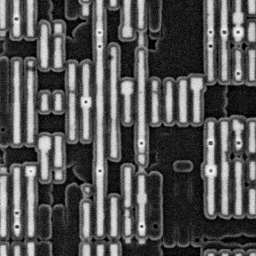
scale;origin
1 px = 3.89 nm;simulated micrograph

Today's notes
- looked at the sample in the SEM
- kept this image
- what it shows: wiring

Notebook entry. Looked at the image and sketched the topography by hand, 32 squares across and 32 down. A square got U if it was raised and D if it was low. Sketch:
UUUUUDDDDDUUUUUUUUUUDDDDDUUUUUUU
UUUUUDDDDDDDUDDUUUUUDDDDDUUUUUUU
UUUUUDDDDDDDUDDUUUUUDDDDDUUUUUUU
UUUUUUDDDDDDUDDUUUUUDDDDDUUUUUUU
DUUUUUUUDDDDUDDUUDDDDDDDDUUUUUUU
DDDDDUUUDDDDUUUDDDDDDDDDDUUUUUUU
DDDDDUUUDDDDUUUDDUDDDDDDDUUUUUUU
UUUUUUUUUDDUUUUDDUDDDDDDDUUUUUUU
UUUUUUUUUUUUUUUDDUDDDDDDDDUUUUUU
UUUUUDDDUUUUUUUDDUUDDDDUUUUUUUUU
UUUUUDDDUUUUUUUUUUUUUUUUUUUDDUDU
UUUUUUUUUUUUUUUUUUUUUUUUUUDDDDDD
UUUUUUUUUUUUUUUUUUUUUUUUUDDDDDDD
UUUUUUUUUUUUUUUUUUUUUUUUUDDDDDDD
UUUUUDDDUUUUUUUUUUUUUUUUUUDDDDDD
UUUUUDDDUUUUUUUUUUUUUUUUUUUUUUUU
UUUUUDDDUUUUUUUDDUUDDDDDDUUUUUUU
UUUUUUUUUUUUUUUDDUUDDDDDDUUUUUUU
DDDDUUUUDDDDUUUDDUUDDDDDDUUUUUUU
DDDDDUUUDDDDUUUDDUDDDDDDDUUUUUDU
DDUUUUUUDDDDUDDDDUDDDDUUDUUUUUUU
DUUUUUUDDDDDUDDUUUDUDDDDDUUUUUUU
UUUUUUDDDDDDUDDUUUUUDDDDDUUUUUUU
UUUUUDDDDDUUUDDUUUUUDDDDDUUUUUUU
UUUUUDDDDDDUUUUUUUUUDDDDDUUUUUUU
UUUUUDDDDDUUUUUUUUUUDDDDDUUUUUUU
UUUUUUDDDDUUUUUUUUUUDDDDDDUUUUUU
UUUUUUDDDDUUUUUUUUUUDDDDDDDDDDDD
UUUUUUDDDDUUUUUUUUUUDDDDDDDDDDDD
UUUUUUDDDDUUUUUUUUUUDDDDDDDDDDDD
UUUUUUDDDDUUUUUDDDDDDDDDDDDDDDDD
UUUUUUDDDDUUUUUDDDDDDDDDDDUUUUUU